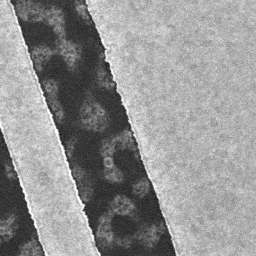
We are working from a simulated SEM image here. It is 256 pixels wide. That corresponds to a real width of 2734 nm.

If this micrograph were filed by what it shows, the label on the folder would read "one or a few lines or trenches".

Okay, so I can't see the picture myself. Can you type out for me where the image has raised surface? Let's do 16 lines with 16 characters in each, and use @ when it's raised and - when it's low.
@-----@@@@@@@@@@
@-----@@@@@@@@@@
@-----@@@@@@@@@@
@@-----@@@@@@@@@
@@-----@@@@@@@@@
@@@----@@@@@@@@@
@@@-----@@@@@@@@
@@@-----@@@@@@@@
@@@@----@@@@@@@@
-@@@-----@@@@@@@
-@@@-----@@@@@@@
-@@@@-----@@@@@@
--@@@-----@@@@@@
--@@@-----@@@@@@
--@@@@-----@@@@@
---@@@-----@@@@@